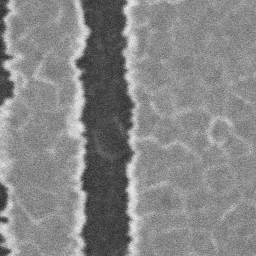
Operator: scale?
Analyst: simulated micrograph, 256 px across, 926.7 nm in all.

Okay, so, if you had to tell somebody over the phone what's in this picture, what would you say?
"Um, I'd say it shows one or a few lines or trenches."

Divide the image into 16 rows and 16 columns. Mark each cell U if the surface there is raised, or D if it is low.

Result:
DUUUUDDDUUUUUUUU
UUUUUDDDUUUUUUUU
UUUUUDDDUUUUUUUU
DUUUUDDDUUUUUUUU
DUUUUDDDUUUUUUUU
DUUUUDDDUUUUUUUU
UUUUUDDDUUUUUUUU
UUUUUDDDUUUUUUUU
UUUUUDDDUUUUUUUU
UUUUUDDDUUUUUUUU
UUUUUDDDUUUUUUUU
UUUUUDDDUUUUUUUU
DUUUUDDDUUUUUUUU
DUUUUDDDUUUUUUUU
UUUUUDDDUUUUUUUU
DUUUUDDDUUUUUUUU